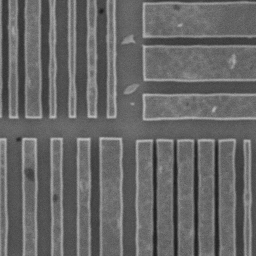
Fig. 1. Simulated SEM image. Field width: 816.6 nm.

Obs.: groups of lines, slits or small figures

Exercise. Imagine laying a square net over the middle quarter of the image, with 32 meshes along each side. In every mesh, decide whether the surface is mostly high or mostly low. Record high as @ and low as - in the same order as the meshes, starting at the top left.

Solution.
-@@---@@---@@-------@@@@@@@@@@@@
-@@---@@---@@-------@@@@@@@@@@@@
-@@---@@---@@-------@@@@@@@@@@@@
--@---@@---@@-------@@@@@@@@@@@@
--@---@@---@@-------------------
-@@---@@---@@-------------------
-@@---@@---@@-------------------
-@@---@@---@@-------------------
-@@---@@---@@-------@@@@@@@@@@@@
-@@---@@---@@-------@@@@@@@@@@@@
-@@---@@---@@-------@@@@@@@@@@@@
-@@---@@---@@-------@@@@@@@@@@@@
-@@---@@---@@-------@@@@@@@@@@@@
--------------------@@@@@@@@@@@-
--------------------------------
--------------------------------
--------------------------------
--------------------------------
--------------------------------
----@@---@@@@@----@@@@-@@@@--@@@
----@@---@@@@@----@@@@-@@@@--@@@
----@@---@@@@@----@@@@-@@@@--@@@
----@@---@@@@@----@@@@--@@@-@@@@
----@@---@@@@@----@@@@--@@@-@@@@
---@@@---@@@@@----@@@@--@@@--@@@
----@@---@@@@@----@@@@--@@@--@@@
----@@---@@@@@----@@@@-@@@@--@@@
----@@---@@@@@----@@@@-@@@@--@@@
----@@---@@@@@----@@@@--@@@--@@@
----@@---@@@@@----@@@@--@@@--@@@
----@@---@@@@@----@@@@--@@@--@@@
----@@---@@@@@----@@@@--@@@--@@@